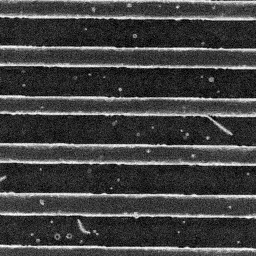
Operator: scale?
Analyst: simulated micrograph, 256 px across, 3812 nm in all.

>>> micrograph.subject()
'lines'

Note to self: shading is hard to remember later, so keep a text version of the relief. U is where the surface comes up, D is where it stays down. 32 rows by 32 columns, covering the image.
UUUUUUUUUUUUUUUUUUUUUUUUUUUUUUUU
UUUUUUUUUUUUUUUUUUUUUUUUUUUUUUUU
DDDDDDDDDDDDDDDDDDDDDDDDDDDDDDDD
DDDDDDDDDDDDDDDDDDDDDDDDDDDDDDDD
DDDDDDDDDDDDDDDDDDDDDDDDDDDDDDDD
DDDDDDDDDDDDDDDDDDDDDDDDDDDDDDDD
UUUUUUUUUUUUUUUUUUUUUUUUUUUUUUUU
UUUUUUUUUUUUUUUUUUUUUUUUUUUUUUUU
DDDDDDDDDDDDDDDDDDDDDDDDDDDDDUUU
DDDDDDDDDDDDDDDDDDDDDDDDDDDDDDDD
DDDDDDDDDDDDDDDDDDDDDDDDDDDDDDDD
DDDDDDDDDDDDDDDDDDDDDDDDDDDDDDDD
UUUUUUUUUUUUUUUUUUUUUUUUUUUUUUUU
UUUUUUUUUUUUUUUUUUUUUUUUUUUUUUUU
DDDDDDDDDDDDDDDDDDDDDDDDDUDDDDDD
DDDDDDDDDDDDDDDDDDDDDDDDDDDDDDDD
DDDDDDDDDDDDDDDDDDDDDDDDDDDDDDDD
DDDDDDDDDDDDDDDDDDDDDDDDDDDDDDDD
UUUUUUUUUUUUUUUUUUUUUUUUUUUUUUUU
UUUUUUUUUUUUUUUUUUUUUUUUUUUUUUUU
DDDDDDDDDDDDDDDDDDDDDDDDDDDDUUUU
DDDDDDDDDDDDDDDDDDDDDDDDDDDDDDDD
DDDDDDDDDDDDDDDDDDDDDDDDDDDDDDDD
DDDDDDDDDDDDDDDDDDDDDDDDDDDDDDDD
UUUUUUUUUUUUUUUUUUUUUUUUUUUUDUDD
UUUUUUUUUUUUUUUUUUUUUUUUUUUUUUUU
UUUUUUUUUUUUUUUUUUUUUUUUUUUUUUUU
DDDDDDDDDDDDDDDDDDDDDDDDDDDDDDDD
DDDDDDDDDDDDDDDDDDDDDDDDDDDDDDDD
DDDDDDDDDDDDDDDDDDDDDDDDDDDDDDDD
DDDDDDDDDDDDDDDDDDDDDDDDDDDDDDDD
UUUUUUUUUUUUUUUUUUUUUUUUUUUUUUUU